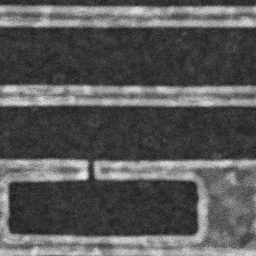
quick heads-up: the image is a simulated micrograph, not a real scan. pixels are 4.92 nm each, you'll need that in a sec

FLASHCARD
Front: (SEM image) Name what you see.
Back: one or a few lines or trenches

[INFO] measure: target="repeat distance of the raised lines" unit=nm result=376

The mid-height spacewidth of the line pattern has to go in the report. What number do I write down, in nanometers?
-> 310